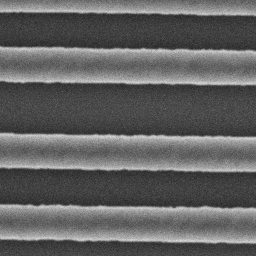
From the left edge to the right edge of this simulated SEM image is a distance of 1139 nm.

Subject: lines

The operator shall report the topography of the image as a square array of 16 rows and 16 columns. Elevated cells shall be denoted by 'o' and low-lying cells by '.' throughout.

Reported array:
oooooooooooooooo
................
................
oooooooooooooooo
oooooooooooooooo
................
................
................
ooooooooooo.....
oooooooooooooooo
..oooooooooooooo
................
................
oooooooooooooooo
oooooooooooooooo
................